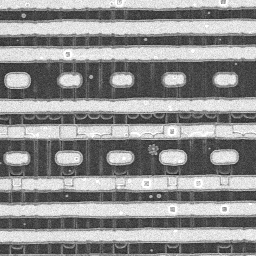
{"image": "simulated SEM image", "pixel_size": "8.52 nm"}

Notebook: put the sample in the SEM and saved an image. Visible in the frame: wiring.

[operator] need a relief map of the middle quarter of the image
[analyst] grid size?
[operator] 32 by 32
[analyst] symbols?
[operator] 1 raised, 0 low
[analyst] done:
00000000000000000000000000000000
00000000000000000000000000000000
11110000000001111000000001111100
11110000000011111000000001111100
11110000000011111000000001111100
11110000000011111000000001111000
00000000000000000000000000000000
00000000000000000000000000000000
00000000000000000000000000000000
11111111111111111111111111111111
11111111111111111111111111111111
11111111111111111111111111111111
00000000000000000000000000000000
00000000000000000000000000000000
00000000000000000000000000000000
11100000000011110000000001111000
11110000000011110000000001111000
11111111111111111111111111111110
11111111111111111111111111111110
00000000000000000000000000000000
00000000000000000000000000000000
00000000000000000000001000000000
11110000000111111000000011111110
11111000000111111000000011111110
11110000000111111000000011111100
00000000000000000000000000000000
00000000000000000000000000000000
00000000000000000000000000000000
00111111111110011111111111001111
00111111111110011111011111001111
11111111111111111111011111111111
11111111111111111111111111111111